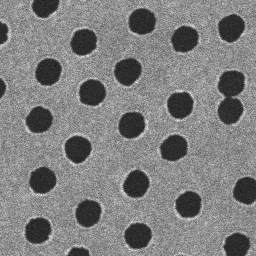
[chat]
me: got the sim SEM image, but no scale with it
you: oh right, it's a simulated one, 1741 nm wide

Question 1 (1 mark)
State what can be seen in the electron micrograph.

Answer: a regular array of holes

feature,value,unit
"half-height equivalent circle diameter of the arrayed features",183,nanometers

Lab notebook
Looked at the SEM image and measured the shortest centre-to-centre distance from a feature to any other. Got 320 nanometres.